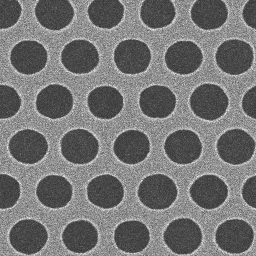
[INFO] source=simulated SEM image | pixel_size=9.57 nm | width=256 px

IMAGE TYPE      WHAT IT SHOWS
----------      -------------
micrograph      a regular array of holes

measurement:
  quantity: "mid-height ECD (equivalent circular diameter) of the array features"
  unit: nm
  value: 346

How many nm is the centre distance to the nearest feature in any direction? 490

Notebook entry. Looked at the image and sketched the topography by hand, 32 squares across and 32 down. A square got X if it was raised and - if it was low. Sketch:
--XXX----XX----XXX----XX----XXX-
---X-----XX----XXX----XX----XX--
--XXX----XX----XXX----XX----XXX-
-XXXXX--XXXXX-XXXXX-XXXXX--XXXXX
XXXXXXXXXXXXXXXXXXXXXXXXXXXXXXXX
XX---XXX---XXXX---XXXX--XXXX---X
X-----XX----XX-----XX----XX-----
X-----XX----XX-----XX----XX-----
XX---XXX----XXX---XXX----XXX---X
XXXXXXXXXXXXXXXXXXXXXXXXXXXXXXXX
XXXXXXXXXXXXXXXXXXXXXXXXXXXXXXXX
--XXX----XX----XXX----XX----XXX-
---XX----XX----XX-----XX-----X--
--XXX----XX----XXX----XX----XX--
-XXXXX--XXXX--XXXX---XXXX---XXX-
XXXXXXXXXXXXXXXXXXXXXXXXXXXXXXXX
XX---XXX---XXXXX--XXXX--XXXX---X
X-----XX----XX-----XX----XX-----
X-----XX----XX-----XX----XX-----
XX---XXX----XXX---XXX----XXX---X
XXXXXXXXXXXXXXXXXXXXXX--XXXXX-XX
XXXXXXXXXXXXXXXXXXXXXXXXXXXXXXXX
--XXX---XXX----XXX----XXX---XXX-
--XXX----XX----XX-----XX----XX--
--XXX----XX----XX-----XX----XX--
--XXX---XXXX---XXX---XXXX---XXX-
XXXXXXXXXXXXXXXXXXXXXXXXXXXXXXXX
XXX-XXXXXXXXXXXXXXXXXX--XXXX--XX
X-----XX----XXX---XXX----XX----X
X-----XX----XX-----XX----XX-----
X-----XX----XXX----XX----XX----X
XX---XXXX--XXXXX-XXXXX--XXXX--XX